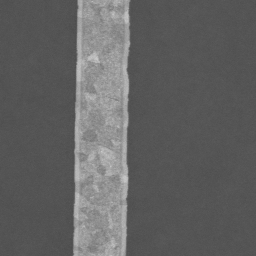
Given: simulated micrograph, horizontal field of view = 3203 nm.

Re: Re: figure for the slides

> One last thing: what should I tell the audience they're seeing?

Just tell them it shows one or a few lines or trenches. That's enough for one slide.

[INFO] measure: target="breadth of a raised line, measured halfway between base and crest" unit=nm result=583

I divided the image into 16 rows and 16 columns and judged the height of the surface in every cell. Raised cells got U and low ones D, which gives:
DDDDDUUUDDDDDDDD
DDDDDUUUDDDDDDDD
DDDDDUUUDDDDDDDD
DDDDDUUUDDDDDDDD
DDDDDUUUDDDDDDDD
DDDDDUUUDDDDDDDD
DDDDDUUUDDDDDDDD
DDDDDUUUDDDDDDDD
DDDDDUUUDDDDDDDD
DDDDDUUUDDDDDDDD
DDDDDUUUDDDDDDDD
DDDDDUUUDDDDDDDD
DDDDDUUUDDDDDDDD
DDDDDUUUDDDDDDDD
DDDDDUUUDDDDDDDD
DDDDDUUUDDDDDDDD